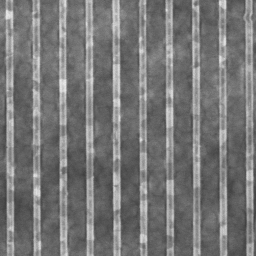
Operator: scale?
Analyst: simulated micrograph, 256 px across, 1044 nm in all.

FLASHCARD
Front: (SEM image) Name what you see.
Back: parallel lines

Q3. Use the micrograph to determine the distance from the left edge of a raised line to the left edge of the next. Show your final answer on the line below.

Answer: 0.109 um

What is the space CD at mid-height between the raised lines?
87.3 nanometres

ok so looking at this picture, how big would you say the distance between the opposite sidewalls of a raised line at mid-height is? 0.0209 µm